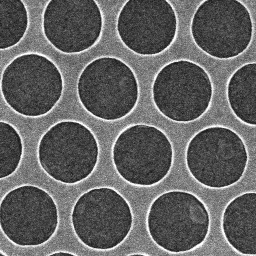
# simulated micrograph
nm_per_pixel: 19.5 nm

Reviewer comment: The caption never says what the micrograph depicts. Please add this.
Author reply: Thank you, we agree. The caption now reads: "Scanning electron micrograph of a regular array of holes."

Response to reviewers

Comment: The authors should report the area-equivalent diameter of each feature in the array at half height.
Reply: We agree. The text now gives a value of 1180 nanometers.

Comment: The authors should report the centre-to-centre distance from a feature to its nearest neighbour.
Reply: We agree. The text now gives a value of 74.2 px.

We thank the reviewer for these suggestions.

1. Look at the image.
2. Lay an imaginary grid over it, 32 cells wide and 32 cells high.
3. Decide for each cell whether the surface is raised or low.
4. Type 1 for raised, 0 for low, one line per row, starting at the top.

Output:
00011100000011110000011110000011
00011100000001100000001100000001
00011000000001100000001100000001
00011000000001100000001100000000
00011100000011100000001100000001
00111110000011110000011110000001
11111111001111111000111111000011
11000011111100011111111111111111
10000001111000001111000001111100
00000000110000000111000000111000
00000000110000000110000000111000
00000000110000000110000000010000
10000001110000000110000000111000
11000001111000000111000000111000
11111111111100001111100001111100
01111110001111111111111111111110
00111100000111100000111110000111
00011000000011100000011100000011
00011000000011000000011000000001
00011000000011000000011000000001
00111000000011000000011000000001
00111100000111100000011100000011
11111110001111110000111110000011
11000111111110111111111111111111
10000011110000011111000011111100
00000001100000001110000001111000
00000001100000001110000000110000
00000001100000001100000000110000
00000001100000001110000000110000
10000011110000001110000000110000
11000111111000011111000001111000
11111111111111111111101111111100